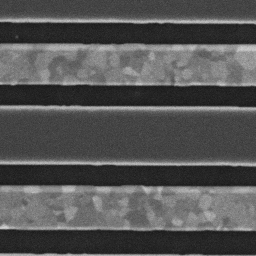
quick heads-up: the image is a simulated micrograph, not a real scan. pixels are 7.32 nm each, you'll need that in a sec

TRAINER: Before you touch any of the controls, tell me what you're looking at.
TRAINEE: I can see lines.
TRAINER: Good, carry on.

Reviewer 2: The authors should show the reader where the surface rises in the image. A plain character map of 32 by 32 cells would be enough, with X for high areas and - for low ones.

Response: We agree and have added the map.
XXXXXXXXXXXXXXXXXXXXXXXXXXXXXXXX
XXXXXXXXXXXXXXXXXXXXXXXXXXXXXXXX
XXXXXXXXXXXXXXXXXXXXXXXXXXXXXXXX
--------------------------------
--------------------------------
--------------------------------
XXXXXXXXXXXXXXXXXXXXXXXXXXXXXXXX
XXXXXXXXXXXXXXXXXXXXXXXXXXXXXXXX
XXXXXXXXXXXXXXXXXXXXXXXXXXXXXXXX
XXXXXXXXXXXXXXXXXXXXXXXXXXXXXXXX
XXXXXXXXXXXXXXXXXXXXXXXXXXXXXXXX
--------------------------------
--------------------------------
XXXXXXXXXXXXXXXXXXXXXXXXXXXXXXXX
XXXXXXXXXXXXXXXXXXXXXXXXXXXXXXXX
XXXXXXXXXXXXXXXXXXXXXXXXXXXXXXXX
XXXXXXXXXXXXXXXXXXXXXXXXXXXXXXXX
XXXXXXXXXXXXXXXXXXXXXXXXXXXXXXXX
XXXXXXXXXXXXXXXXXXXXXXXXXXXXXXXX
XXXXXXXXXXXXXXXXXXXXXXXXXXXXXXXX
XXXXXXXXXXXXXXXXXXXXXXXXXXXXXXXX
--------------------------------
--------------------------------
XXXXXXXXXXXXXXXXXXXXXXXXXXXX----
XXXXXXXXXXXXXXXXXXXXXXXXXXXXXXXX
XXXXXXXXXXXXXXXXXXXXXXXXXXXXXXXX
XXXXXXXXXXXXXXXXXXXXXXXXXXXXXXXX
XXXXXXXXXXXXXXXXXXXXXXXXXXXXXXXX
XXXXXXXXXXXXXXXXXXXXXXXXXXXXXXXX
--------------------------------
--------------------------------
--------------------------------